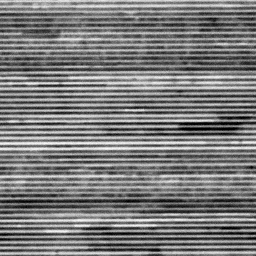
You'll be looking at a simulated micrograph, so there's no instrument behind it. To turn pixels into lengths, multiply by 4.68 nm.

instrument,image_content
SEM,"parallel lines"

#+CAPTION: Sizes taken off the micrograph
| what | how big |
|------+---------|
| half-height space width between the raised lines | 21.1 nm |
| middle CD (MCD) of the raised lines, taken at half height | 0.0047 um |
